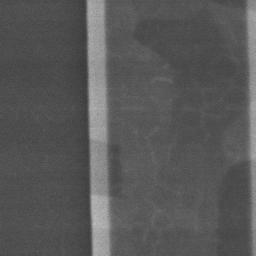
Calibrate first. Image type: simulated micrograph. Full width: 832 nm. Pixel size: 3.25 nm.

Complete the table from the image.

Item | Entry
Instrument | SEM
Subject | one or a few lines or trenches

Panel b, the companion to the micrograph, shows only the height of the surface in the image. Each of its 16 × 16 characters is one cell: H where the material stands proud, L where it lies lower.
LLLLLLHHHHHHHHHH
LLLLLLHHHHHHHHHH
LLLLLLHHHHHHHHHH
LLLLLLHHHHHHHHHH
LLLLLLHHHHHHHHHH
LLLLLLHHHHHHHHHH
LLLLLLHHHHHHHHHH
LLLLLLHHHHHHHHHH
LLLLLLHHHHHHHHHH
LLLLLLHHHHHHHHHH
LLLLLLHHHHHHHHHH
LLLLLLHHHHHHHHHH
LLLLLLHHHHHHHHHH
LLLLLLHHHHHHHHHH
LLLLLLHHHHHHHHHH
LLLLLLHHHHHHHHHH